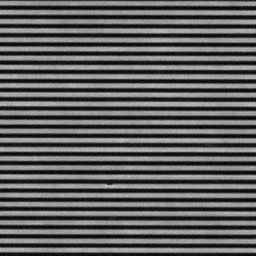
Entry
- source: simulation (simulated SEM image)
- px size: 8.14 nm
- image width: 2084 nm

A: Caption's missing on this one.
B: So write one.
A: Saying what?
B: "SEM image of parallel lines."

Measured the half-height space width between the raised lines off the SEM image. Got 40.7 nm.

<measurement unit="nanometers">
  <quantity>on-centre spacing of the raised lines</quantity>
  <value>74.5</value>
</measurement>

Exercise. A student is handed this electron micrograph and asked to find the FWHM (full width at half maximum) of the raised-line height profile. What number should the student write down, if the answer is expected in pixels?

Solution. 4